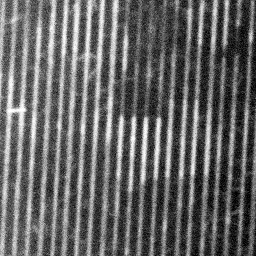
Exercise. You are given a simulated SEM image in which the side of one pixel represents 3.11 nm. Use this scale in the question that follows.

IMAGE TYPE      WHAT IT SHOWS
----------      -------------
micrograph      parallel lines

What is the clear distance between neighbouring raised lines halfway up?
29.9 nm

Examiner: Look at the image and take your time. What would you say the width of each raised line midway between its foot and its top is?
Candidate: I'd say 0.0089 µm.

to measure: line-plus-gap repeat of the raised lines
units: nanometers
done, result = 38.8